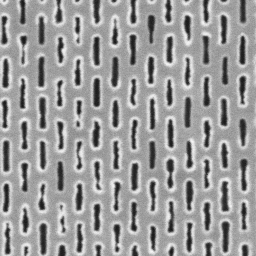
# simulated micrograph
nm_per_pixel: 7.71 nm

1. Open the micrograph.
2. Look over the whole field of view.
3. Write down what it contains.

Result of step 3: a regular array of holes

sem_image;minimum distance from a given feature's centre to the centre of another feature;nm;206